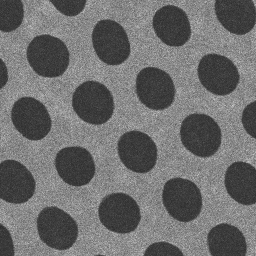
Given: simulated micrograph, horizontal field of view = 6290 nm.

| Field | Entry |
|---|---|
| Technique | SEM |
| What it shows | a regular array of holes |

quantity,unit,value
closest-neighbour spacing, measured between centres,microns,1.57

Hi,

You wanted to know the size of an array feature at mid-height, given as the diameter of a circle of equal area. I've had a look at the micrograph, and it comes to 1030 nanometres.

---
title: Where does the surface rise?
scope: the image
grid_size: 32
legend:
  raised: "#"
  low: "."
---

...####....################.....
...#####..##########...####.....
...##########.#####.....###.....
..##########...####.....####....
#####.#####.....####....########
####....####....#####..#########
###......###....################
###......####...#########....###
.###....##########..#####.....##
.####..##########....####.....##
.#########...####.....###.....##
#########.....###.....####...###
##...####.....###.....##########
#.....###.....#####..##########.
#.....####....##########..####..
##....#####..##########....###..
##....##########..####......###.
####.##########....####.....####
########..#####.....###....#####
#######....####.....#####.######
...####.....###....##########..#
....###.....#####.##########....
....####...##########...####....
....################.....###....
....#########...####.....####...
#############....###.....#####..
#####...####......###....#######
#####....####.....####..########
.####.....###....##########...##
.####.....################.....#
..####...##########..#####.....#
..################.....###.....#